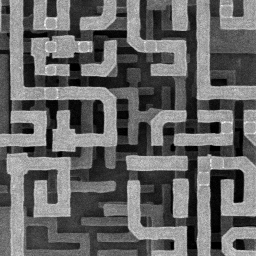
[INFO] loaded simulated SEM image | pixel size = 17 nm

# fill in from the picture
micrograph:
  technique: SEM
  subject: wiring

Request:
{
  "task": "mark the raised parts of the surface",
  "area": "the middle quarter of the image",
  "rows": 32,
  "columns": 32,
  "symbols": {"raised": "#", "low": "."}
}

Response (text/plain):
#...#########.........#########.
#...#########.........#########.
#...#########.........#########.
#..........................####.
#...........................##..
#...........................##..
##################..........##..
##################..........##..
##############.###..........##..
#...###...###...##..........##..
#...###...###...##..........##..
#...###...###...###..####..###..
#...###...###...###############.
#...###...###...###############.
#...###...###...###..#####.###..
#...###...###...##....###...##..
##..###...###...##....###...##..
###.#####.###...##....###...###.
#############...##....###...####
#############...##....###...####
#############...............###.
###.###...###...............##..
....###...###...............##..
#######...###...###############.
#######...###...###############.
#######....##...###############.
##................#####....####.
#...........................##..
#...........................##..
####......###...###........####.
#############...###........####.
############....###........####.